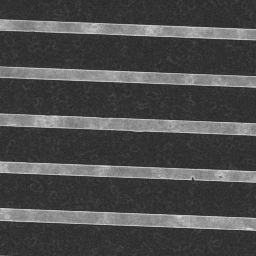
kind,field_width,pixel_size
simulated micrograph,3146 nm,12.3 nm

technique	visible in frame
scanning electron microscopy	parallel lines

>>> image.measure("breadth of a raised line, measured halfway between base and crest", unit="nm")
138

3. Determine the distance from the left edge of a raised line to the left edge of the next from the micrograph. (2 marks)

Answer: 582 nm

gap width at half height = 0.439 um